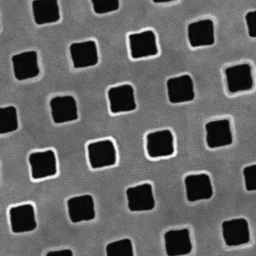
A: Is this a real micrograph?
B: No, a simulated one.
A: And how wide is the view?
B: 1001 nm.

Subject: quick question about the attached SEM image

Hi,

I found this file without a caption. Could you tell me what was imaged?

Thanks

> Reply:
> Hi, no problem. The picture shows a regular array of holes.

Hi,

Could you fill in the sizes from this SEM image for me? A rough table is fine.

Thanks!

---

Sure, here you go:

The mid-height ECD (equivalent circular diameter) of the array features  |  0.108 microns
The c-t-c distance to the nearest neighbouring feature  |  227 nm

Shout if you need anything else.